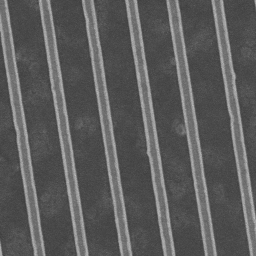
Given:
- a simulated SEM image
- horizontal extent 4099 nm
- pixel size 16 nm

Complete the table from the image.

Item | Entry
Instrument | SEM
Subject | parallel lines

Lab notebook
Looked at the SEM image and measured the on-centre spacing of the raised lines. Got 683 nanometers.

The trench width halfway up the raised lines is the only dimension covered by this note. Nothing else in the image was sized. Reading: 552 nm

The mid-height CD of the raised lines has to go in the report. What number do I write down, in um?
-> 0.135